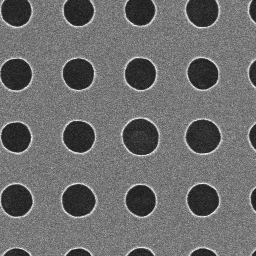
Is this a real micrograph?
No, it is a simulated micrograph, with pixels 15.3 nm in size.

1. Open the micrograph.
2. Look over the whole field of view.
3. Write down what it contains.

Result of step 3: a regular array of holes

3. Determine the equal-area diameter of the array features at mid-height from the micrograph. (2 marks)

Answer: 489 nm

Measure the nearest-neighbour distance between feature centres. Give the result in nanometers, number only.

951